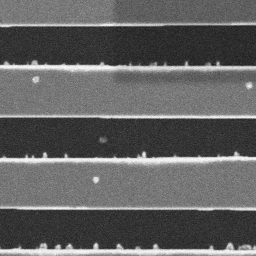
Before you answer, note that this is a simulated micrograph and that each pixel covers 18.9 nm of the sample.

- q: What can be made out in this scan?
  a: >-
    lines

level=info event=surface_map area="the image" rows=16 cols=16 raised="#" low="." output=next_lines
################
################
................
................
################
################
################
................
................
................
################
################
################
................
................
................